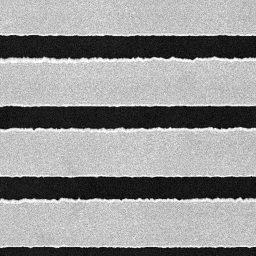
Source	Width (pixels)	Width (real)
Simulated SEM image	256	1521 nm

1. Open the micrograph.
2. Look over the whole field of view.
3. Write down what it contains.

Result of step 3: lines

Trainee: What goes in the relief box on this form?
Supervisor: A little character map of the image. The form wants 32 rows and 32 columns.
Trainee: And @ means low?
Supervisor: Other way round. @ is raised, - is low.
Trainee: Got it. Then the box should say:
@@@@@@@@@@@@@@@@@@@@@@@@@@@@@@@@
@@@@@@@@@@@@@@@@@@@@@@@@@@@@@@@@
@@@@@@@@@@@@@@@@@@@@@@@@@@@@@@@@
@@@@@@@@@@@@@@@@@@@@@@@@@@@@@@@@
---------------@----------------
--------------------------------
--------------------------------
@@@@@@@@@@@@@@@@@@@@@@@@@@@@@@@@
@@@@@@@@@@@@@@@@@@@@@@@@@@@@@@@@
@@@@@@@@@@@@@@@@@@@@@@@@@@@@@@@@
@@@@@@@@@@@@@@@@@@@@@@@@@@@@@@@@
@@@@@@@@@@@@@@@@@@@@@@@@@@@@@@@@
@@@@@@@@@@@@@@@@@@@@@@@@@@@@@@@@
--------------------------------
--------------------------------
--------------------------------
@@@@@@@@@@@@@@@@@@@@@@@@@@@@@@@@
@@@@@@@@@@@@@@@@@@@@@@@@@@@@@@@@
@@@@@@@@@@@@@@@@@@@@@@@@@@@@@@@@
@@@@@@@@@@@@@@@@@@@@@@@@@@@@@@@@
@@@@@@@@@@@@@@@@@@@@@@@@@@@@@@@@
@@@@@@@@@@@@@@@@@@@@@@@@@@@@@@@@
--------------------------------
--------------------------------
--------------------------------
@@@@@@@@@@@@@@@@@@@@@@@@@@@@@@@@
@@@@@@@@@@@@@@@@@@@@@@@@@@@@@@@@
@@@@@@@@@@@@@@@@@@@@@@@@@@@@@@@@
@@@@@@@@@@@@@@@@@@@@@@@@@@@@@@@@
@@@@@@@@@@@@@@@@@@@@@@@@@@@@@@@@
@@@@@@@@@@@@@@@@@@@@@@@@@@@@@@@@
--------------------------------